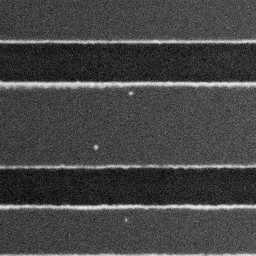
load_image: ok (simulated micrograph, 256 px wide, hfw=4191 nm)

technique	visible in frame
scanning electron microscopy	lines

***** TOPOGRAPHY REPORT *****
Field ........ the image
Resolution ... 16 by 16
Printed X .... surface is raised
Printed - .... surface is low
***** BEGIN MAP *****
XXXXXXXXXXXXXXXX
XXXXXXXXXXXXXXXX
XXXXXXXXXXXXXXXX
----------------
----------------
XXXXXXXXXXXXXXXX
XXXXXXXXXXXXXXXX
XXXXXXXXXXXXXXXX
XXXXXXXXXXXXXXXX
XXXXXXXXXXXXXXXX
----------------
----------------
----------------
XXXXXXXXXXXXXXXX
XXXXXXXXXXXXXXXX
XXXXXXXXXXXXXXXX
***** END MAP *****